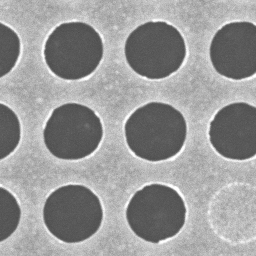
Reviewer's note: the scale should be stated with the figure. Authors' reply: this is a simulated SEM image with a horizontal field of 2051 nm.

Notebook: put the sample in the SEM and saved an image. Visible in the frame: holes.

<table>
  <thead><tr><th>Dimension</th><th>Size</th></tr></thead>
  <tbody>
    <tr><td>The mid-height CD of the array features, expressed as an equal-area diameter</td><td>59.4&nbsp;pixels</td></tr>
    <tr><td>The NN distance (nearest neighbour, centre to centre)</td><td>0.652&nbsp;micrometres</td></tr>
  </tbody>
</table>